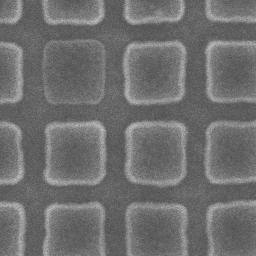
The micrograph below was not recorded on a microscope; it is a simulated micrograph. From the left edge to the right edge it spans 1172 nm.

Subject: raised bodies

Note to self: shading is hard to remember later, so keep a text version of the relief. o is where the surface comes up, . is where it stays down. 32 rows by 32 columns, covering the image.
ooo..oooooooo...ooooooo...oooooo
oo....ooooooo...ooooooo...oooooo
oo....oooooo....ooo.........o.oo
................................
................................
o.................oooo.....ooooo
ooo.............ooooooo...oooooo
oo..............ooooooo...oooooo
oo..............ooooooo...oooooo
oo..............ooooooo...oooooo
ooo.............ooooooo...oooooo
ooo.............ooooooo...oooooo
oo..............oooooo.....ooo.o
................................
................................
o................ooooo.....ooooo
oo....ooooooo...ooooooo...oooooo
oo....ooooooo...ooooooo...oooooo
oo....ooooooo...ooooooo...oooooo
ooo...ooooooo...ooooooo...oooooo
ooo...ooooooo...ooooooo...oooooo
ooo...ooooooo...ooooooo...oooooo
oo....oooooo.....ooooo.....oooo.
................................
................................
.............................ooo
ooo...ooooooo...ooooooo...oooooo
ooo...ooooooo...ooooooo...oooooo
ooo...ooooooo...ooooooo...oooooo
ooo...ooooooo...ooooooo...oooooo
ooo...ooooooo...ooooooo...oooooo
ooo..oooooooo...ooooooo...oooooo